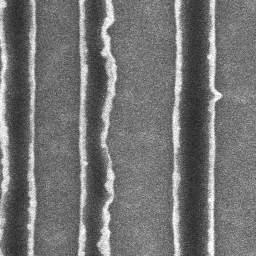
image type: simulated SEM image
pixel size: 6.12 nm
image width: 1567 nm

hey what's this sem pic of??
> one or a few lines or trenches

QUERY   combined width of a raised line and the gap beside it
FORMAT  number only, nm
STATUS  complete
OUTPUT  572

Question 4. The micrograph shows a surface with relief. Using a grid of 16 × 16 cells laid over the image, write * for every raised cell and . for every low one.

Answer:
**...**....**...
**...**....**...
**...**....**...
**...**....**...
**...**....**...
**...**....**...
**...**....**...
**...**....**...
**...**....**...
**...**....**...
**...**....**...
**...**....**...
**...**....**...
**...**....**...
**...**....**...
**...**....**...